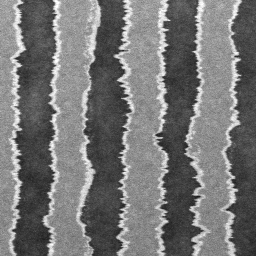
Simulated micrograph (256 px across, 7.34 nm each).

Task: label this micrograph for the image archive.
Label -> one or a few lines or trenches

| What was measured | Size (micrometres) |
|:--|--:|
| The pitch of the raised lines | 0.526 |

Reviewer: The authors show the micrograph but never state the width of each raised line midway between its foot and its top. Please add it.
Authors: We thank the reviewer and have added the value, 251 nanometres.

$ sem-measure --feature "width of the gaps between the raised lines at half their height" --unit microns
0.27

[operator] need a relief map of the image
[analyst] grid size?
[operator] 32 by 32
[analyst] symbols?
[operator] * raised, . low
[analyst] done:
**.....*****....*****....*****..
**.....*****....****.....****...
**.....*****....****.....****...
**.....*****....****.....****...
**.....*****....****.....****...
***....*****....****.....****...
**.....****....*****.....****...
**.....*****...*****.....****...
**.....****.....****.....****...
**.....****.....****.....****...
**.....****....*****.....****...
**.....****.....****.....****...
**.....***......****.....****...
**.....****......****....****...
**.....****.....****....*****...
**.....****.....****....*****...
**.....***......****....****....
**.....****.....****...******...
**....****......****....****....
**.....****....******...****....
**.....****.....*****...*****...
**.....****.....*****....****...
**.....****....*****.....****...
**.....****....*****.....****...
**....****......****.....****...
**....****......****.....****...
**....****.....*****....*****...
**....****.....*****.....****...
**....****.....*****.....***....
**.....****....*****.....***....
*.....*****.....****.....****...
**....*****....*****.....****...